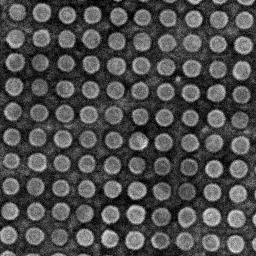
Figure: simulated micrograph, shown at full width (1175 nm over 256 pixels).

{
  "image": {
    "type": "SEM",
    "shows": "a regular array of raised bodies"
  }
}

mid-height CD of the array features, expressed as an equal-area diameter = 0.0785 micrometres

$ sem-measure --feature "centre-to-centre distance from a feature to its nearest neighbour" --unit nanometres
111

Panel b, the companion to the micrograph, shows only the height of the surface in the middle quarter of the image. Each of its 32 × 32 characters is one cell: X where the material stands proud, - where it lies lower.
XX---XXXX--XXXX--XXXX--XXXXX--XX
XX---XXX---XXXX--XXXX--XXXXX--XX
-------------XX---------XXX---XX
--------------------------------
XX----X-------------------------
XX---XXX---XXXX--XXXX---XXX---XX
XX---XXXX--XXXX--XXXX--XXXX---XX
XX---XXXX--XXXX--XXXX--XXXX--XXX
-------X----------XX----XXX---XX
--------------------------------
X-------------------------------
XX--XXXX---XXX----XX------------
XX--XXXX--XXXXX--XXXX--XXXX---XX
XX--XXXX---XXX---XXXX--XXXX---XX
X----XXX---XXX----XXX--XXXX---XX
--------------------------------
--------------------------------
XX---XXX---XXX---XXX------------
XX--XXXX---XXX---XXXX--XXXX---XX
XX--XXXX---XXXX-XXXXX--XXXX---XX
X----XX----XXX---XXX---XXXX--XXX
------------------------XX----XX
--------------------------------
X----XX-----X-------------------
X---XXXX--XXXX--XXXX---XXX----XX
X---XXX---XXXX--XXXX---XXX---XXX
X---XXX---XXXX---XXX---XXX---XXX
------------------------X-----XX
--------------------------------
X----XX----XX-------------------
X---XXXX--XXXX--XXXX---XXX---XXX
X---XXXX--XXXX--XXXX--XXXX---XXX